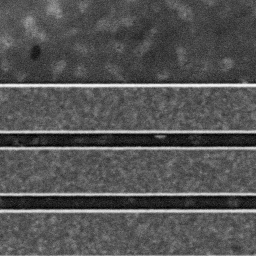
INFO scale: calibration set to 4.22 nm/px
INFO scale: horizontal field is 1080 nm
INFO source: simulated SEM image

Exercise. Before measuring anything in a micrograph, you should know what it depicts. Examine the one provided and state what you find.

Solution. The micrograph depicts parallel lines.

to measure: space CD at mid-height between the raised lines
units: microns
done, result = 0.0654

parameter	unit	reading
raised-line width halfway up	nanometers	199